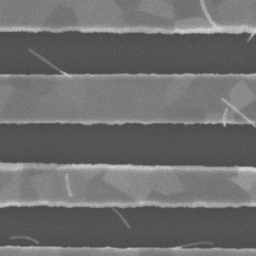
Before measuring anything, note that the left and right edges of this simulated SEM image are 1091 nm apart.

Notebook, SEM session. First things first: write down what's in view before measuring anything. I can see lines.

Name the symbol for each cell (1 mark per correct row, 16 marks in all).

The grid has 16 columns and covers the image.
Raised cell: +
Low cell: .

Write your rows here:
++++++++++++++++
++++++++++++++++
................
................
................
++++++++++++++++
++++++++++++++++
++++++++++++++++
................
................
+++++++++++++++.
++++++++++++++++
++++++++++++++++
................
................
+++++++.........